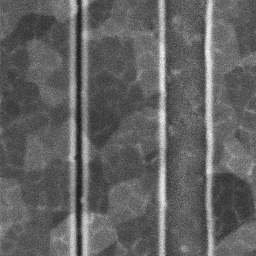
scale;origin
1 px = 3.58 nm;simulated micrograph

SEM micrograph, one or a few lines or trenches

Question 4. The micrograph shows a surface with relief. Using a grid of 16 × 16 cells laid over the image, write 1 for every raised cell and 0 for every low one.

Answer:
1111111111000111
1111111111000111
1111111111000111
1111111111000111
1111111111000111
1111111111000111
1111111111000111
1111111111000111
1111111111000111
1111111111000111
1111111111000111
1111111111000111
1111111111000111
1111111111000111
1111111111000111
1111111111000111